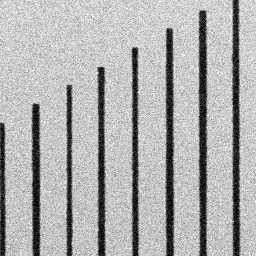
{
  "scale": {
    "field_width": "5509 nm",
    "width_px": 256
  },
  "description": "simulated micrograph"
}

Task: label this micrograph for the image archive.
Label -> parallel lines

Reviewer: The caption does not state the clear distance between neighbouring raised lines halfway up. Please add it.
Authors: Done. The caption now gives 0.167 micrometres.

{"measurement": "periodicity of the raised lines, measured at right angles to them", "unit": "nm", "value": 722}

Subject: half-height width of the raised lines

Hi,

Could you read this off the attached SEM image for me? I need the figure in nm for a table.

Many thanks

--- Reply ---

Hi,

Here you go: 560